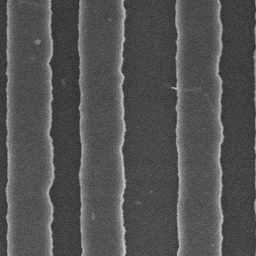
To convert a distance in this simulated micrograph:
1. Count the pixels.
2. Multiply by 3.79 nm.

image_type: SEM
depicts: lines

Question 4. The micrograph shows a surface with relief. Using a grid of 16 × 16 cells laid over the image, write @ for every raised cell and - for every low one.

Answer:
@@@--@@@---@@@--
@@@--@@@---@@@--
@@@--@@@---@@@--
@@@--@@@---@@@--
@@@--@@@---@@@--
@@@--@@@---@@@--
@@@--@@@---@@@--
@@@--@@@---@@@--
@@@--@@@---@@@--
@@@--@@@---@@@--
-@@--@@@---@@@--
@@@--@@@---@@@--
@@@--@@@---@@@--
@@@--@@@---@@@--
@@@--@@@---@@@--
-@@--@@@---@@@--